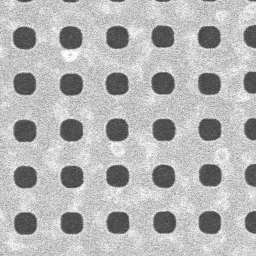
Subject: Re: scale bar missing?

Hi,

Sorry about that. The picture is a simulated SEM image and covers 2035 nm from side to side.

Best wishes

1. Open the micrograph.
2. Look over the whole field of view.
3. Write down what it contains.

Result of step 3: a regular array of holes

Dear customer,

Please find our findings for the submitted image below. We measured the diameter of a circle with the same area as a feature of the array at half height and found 190 nm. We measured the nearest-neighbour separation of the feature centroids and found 0.363 µm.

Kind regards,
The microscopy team